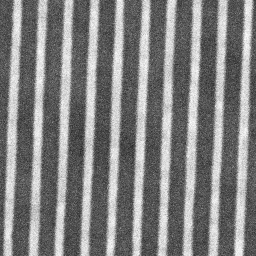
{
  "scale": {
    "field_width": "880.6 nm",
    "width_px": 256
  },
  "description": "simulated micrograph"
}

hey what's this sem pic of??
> parallel lines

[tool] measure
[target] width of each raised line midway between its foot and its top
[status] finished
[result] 24.1 nm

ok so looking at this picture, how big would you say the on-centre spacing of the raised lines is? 0.0884 µm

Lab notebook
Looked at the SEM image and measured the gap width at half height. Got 0.0645 µm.